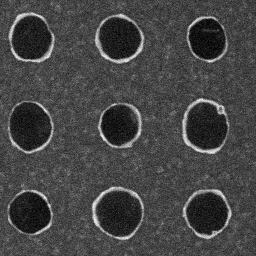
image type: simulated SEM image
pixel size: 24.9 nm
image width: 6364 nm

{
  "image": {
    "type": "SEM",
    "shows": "a regular array of holes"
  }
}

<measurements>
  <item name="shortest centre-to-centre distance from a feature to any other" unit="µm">2.15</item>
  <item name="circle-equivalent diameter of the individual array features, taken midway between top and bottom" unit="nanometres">1080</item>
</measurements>